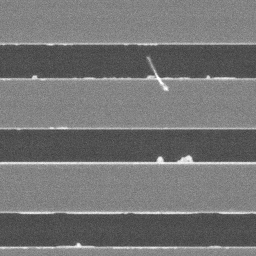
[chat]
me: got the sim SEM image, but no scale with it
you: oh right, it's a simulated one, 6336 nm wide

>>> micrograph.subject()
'lines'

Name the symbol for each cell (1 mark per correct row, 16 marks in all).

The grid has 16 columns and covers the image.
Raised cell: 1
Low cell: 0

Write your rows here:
1111111111111111
1111111111111111
1111111111111111
0000000000000000
0000000000000000
1111111111111111
1111111111111111
1111111111111111
0000000000000000
0000000000000000
1111111111111111
1111111111111111
1111111111111111
0000000000000000
0000000000000000
1111111111111111